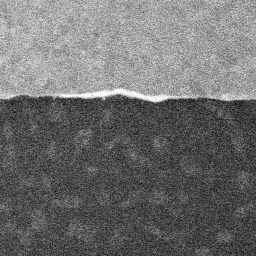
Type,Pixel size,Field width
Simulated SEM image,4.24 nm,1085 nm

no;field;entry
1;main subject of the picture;one or a few lines or trenches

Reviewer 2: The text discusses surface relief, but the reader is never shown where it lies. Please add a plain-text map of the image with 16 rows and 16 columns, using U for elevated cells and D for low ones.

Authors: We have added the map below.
UUUUUUUUUUUUUUUU
UUUUUUUUUUUUUUUU
UUUUUUUUUUUUUUUU
UUUUUUUUUUUUUUUU
UUUUUUUUUUUUUUUU
UUUUUUUUUUUUUUUU
DDDDDDDDDDDDDDDD
DDDDDDDDDDDDDDDD
DDDDDDDDDDDDDDDD
DDDDDDDDDDDDDDDD
DDDDDDDDDDDDDDDD
DDDDDDDDDDDDDDDD
DDDDDDDDDDDDDDDD
DDDDDDDDDDDDDDDD
DDDDDDDDDDDDDDDD
DDDDDDDDDDDDDDDD